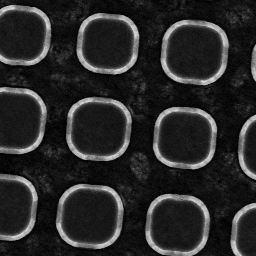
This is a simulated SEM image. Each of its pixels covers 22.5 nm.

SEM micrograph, raised bodies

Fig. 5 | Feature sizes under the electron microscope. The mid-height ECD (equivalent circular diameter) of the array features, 1.4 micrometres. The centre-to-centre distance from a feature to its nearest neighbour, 1940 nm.